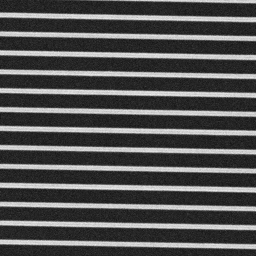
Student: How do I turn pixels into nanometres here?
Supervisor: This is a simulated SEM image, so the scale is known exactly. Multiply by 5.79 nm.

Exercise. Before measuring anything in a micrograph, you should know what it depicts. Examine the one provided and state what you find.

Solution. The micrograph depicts parallel lines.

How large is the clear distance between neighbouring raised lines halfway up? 89.1 nanometers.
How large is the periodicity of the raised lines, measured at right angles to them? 110 nanometers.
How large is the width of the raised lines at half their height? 22.4 nm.